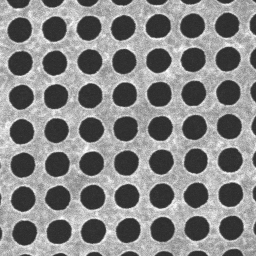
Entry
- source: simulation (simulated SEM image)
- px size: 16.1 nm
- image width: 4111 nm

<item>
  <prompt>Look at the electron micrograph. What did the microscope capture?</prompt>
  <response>a regular array of holes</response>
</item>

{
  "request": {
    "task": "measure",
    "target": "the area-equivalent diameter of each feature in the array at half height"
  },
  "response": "409 nm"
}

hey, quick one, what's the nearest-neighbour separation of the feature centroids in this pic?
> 540 nm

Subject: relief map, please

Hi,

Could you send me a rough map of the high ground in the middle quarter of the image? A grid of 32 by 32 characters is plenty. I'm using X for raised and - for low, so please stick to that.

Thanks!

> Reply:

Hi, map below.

-XXX------XX------XXX-----XXX---
XXXX-----XXXX----XXXX-----XXXX--
XXXXX--XXXXXXX--XXXXXXXXXXXXXXXX
XXXXXXXXXXXXXXXXXXXXXXXXXXXXXXXX
XXXXXXXXXXXXXXX-XXXXXXX--XXXXXX-
XXXXX----XXXX-----XXX-----XXXX--
-XXX-----XXX------XXX------XXX--
-XXX------XX------XXX------XX---
-XX-------XX------XXX------XX---
-XXX-----XXX------XXX-----XXXX--
XXXX----XXXXX----XXXXX---XXXXXX-
XXXXXXXXXXXXXXXXXXXXXXXXXXXXXXXX
XXXXXXXXXXXXXXXXXXXXXXXXXXXXXXXX
XXXXX---XXXXXX---XXXXX----XXXXX-
-XXX-----XXXX-----XXX------XXX--
-XXX------XX------XXX------XXX--
-XXX------XX------XXX------XXX--
-XXX------XXX-----XXX------XXX--
-XXX-----XXXX-----XXXX----XXXX--
XXXXXX--XXXXXXXXXXXXXXXXXXXXXXXX
XXXXXXXXXXXXXXXXXXXXXXXXXXXXXXXX
XXXXXXXXXXXXXXX-XXXXXXXX--XXXXX-
XXXXX----XXXX-----XXXX-----XXX--
-XXX------XXX------XX------XXX--
--XX------XX-------XX-------XX--
-XXX------XX-------XX------XXX--
-XXX------XXX-----XXXX-----XXXX-
-XXXX----XXXXX---XXXXXX--XXXXXXX
XXXXXXXXXXXXXXXXXXXXXXXXXXXXXXXX
XXXXXXXXXXXXXXXXXXXXXXXXXXXXXXXX
XXXXXX---XXXXX----XXXXX----XXXX-
-XXXX-----XXX------XXX-----XXX--